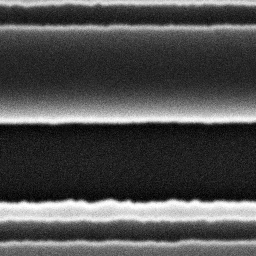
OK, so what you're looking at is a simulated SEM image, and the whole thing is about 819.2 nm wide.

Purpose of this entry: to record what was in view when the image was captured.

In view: lines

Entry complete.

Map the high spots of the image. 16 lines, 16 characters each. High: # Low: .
################
################
################
################
################
################
################
################
................
................
................
................
................
################
################
################